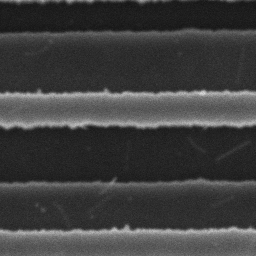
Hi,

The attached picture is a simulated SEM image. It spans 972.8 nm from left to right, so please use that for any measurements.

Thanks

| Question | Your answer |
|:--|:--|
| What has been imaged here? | lines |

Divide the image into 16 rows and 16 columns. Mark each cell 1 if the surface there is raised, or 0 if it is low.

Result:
0000000000000000
0000000000000000
1111111111111111
1111111111111111
1111111111111111
1111111111111111
1111111111111111
1111111111111111
0000000000000000
0000000000000000
0000000000000000
0010011111111111
1111111111111111
1111111111111111
1111111111111111
1111111111111111